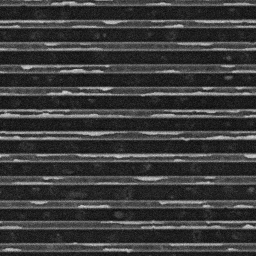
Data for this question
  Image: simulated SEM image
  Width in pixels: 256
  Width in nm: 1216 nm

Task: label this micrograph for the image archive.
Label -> parallel lines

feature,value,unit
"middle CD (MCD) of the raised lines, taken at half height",39.7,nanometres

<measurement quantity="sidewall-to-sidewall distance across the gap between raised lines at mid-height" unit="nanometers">67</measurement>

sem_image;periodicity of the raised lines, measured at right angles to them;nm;106